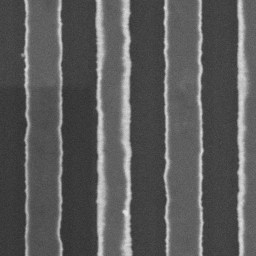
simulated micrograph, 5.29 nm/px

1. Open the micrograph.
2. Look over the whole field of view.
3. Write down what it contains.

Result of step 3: lines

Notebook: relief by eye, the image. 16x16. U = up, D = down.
DDUUDDUUDDUUUDDU
DDUUDDUUDDUUUDDU
DDUUDDUUDDUUUDDU
DDUUDDUUDDUUUDDU
DDUUDDUUDDUUUDDU
DDUUDDUUDDUUUDDU
DDUUDDUUDDUUUDDU
DDUUDDUUDDUUUDDU
DDUUDDUUDDUUUDDU
DDUUDDUUDDUUUDDU
DDUUDDUUDDUUUDDU
DDUUDDUUDDUUUDDU
DDUUDDUUDDUUUDDU
DDUUDDUUDDUUUDDU
DDUUDDUUDDUUUDDU
DDUUDDUUDDUUUDDU